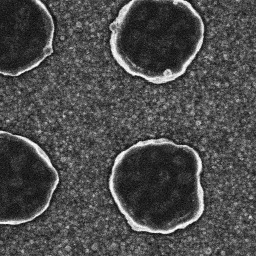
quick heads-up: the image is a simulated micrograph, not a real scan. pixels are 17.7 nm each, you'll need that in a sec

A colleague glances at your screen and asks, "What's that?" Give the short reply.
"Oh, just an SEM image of raised bodies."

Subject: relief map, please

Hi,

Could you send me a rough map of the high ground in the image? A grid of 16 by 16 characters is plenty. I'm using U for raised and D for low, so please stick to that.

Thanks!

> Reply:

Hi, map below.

UUUDDDDDUUUUDDDD
UUUDDDDUUUUUUDDD
UUUDDDDUUUUUUDDD
UUUDDDDUUUUUDDDD
UDDDDDDDUUUDDDDD
DDDDDDDDDDDDDDDD
DDDDDDDDDDDDDDDD
DDDDDDDDDDDDDDDD
UDDDDDDDDDDDDDDD
UUDDDDDDUUUUDDDD
UUUDDDDUUUUUDDDD
UUUUDDDUUUUUDDDD
UUUDDDDUUUUUUDDD
UUDDDDDDUUUUDDDD
DDDDDDDDDDDDDDDD
DDDDDDDDDDDDDDDD